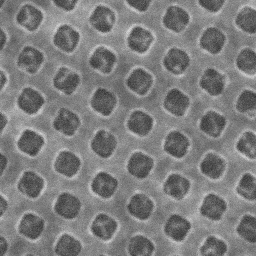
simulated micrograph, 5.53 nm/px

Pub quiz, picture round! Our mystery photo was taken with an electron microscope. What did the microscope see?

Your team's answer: a regular array of holes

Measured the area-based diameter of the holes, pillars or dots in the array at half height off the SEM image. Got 149 nm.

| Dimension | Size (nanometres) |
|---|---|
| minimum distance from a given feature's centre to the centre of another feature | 229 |